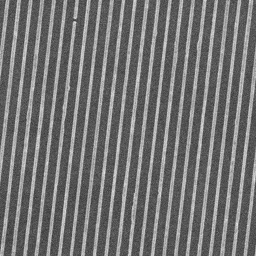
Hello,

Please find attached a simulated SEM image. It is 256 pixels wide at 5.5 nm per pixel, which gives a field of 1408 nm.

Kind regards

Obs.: parallel lines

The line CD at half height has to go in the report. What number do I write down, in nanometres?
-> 16.4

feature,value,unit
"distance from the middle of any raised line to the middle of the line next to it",11.5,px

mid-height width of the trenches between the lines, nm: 48.5